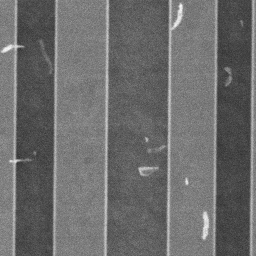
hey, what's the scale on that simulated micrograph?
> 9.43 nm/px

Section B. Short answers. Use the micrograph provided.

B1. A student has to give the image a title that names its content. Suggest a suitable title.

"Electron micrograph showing groups of lines, slits or small figures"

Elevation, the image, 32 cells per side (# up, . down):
##.....######........######.....
##.....######........######.....
##.....######........######.....
##.....######........######.....
##.....######........######.....
##.....######........######.....
##.....######........######.....
##.....######........######.....
##.....######........######.....
##.....######........######.....
##.....######........######.....
##.....######........######.....
##.....######........######.....
##.....######........######.....
##.....######........######....#
##.....######........######....#
##.....######........######....#
##.....######........######....#
##.....######........######....#
##.....######........######....#
##.....######........######....#
##.....######........######....#
##.....######........######....#
##.....######........######....#
##.....######........######....#
##.....######........######....#
##.....######........######....#
##.....######........######....#
##.....######........######....#
##.....######........######....#
##.....######........######....#
##.....######........######....#